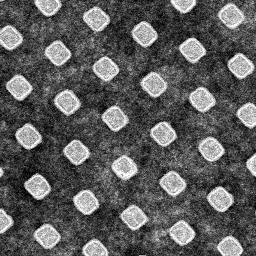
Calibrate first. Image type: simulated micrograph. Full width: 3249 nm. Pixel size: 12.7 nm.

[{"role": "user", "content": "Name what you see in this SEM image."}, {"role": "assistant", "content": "a regular array of raised bodies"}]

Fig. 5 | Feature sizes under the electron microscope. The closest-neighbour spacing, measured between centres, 638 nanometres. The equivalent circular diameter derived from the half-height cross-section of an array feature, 280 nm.